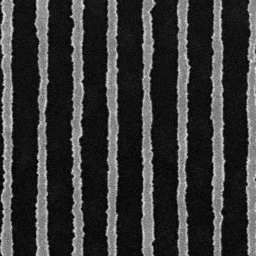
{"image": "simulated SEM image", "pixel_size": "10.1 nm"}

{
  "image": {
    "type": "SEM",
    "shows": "parallel lines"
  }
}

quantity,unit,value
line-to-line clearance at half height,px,26.2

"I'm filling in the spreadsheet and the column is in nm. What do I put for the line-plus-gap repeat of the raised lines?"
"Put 353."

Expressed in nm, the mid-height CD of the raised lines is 85.5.